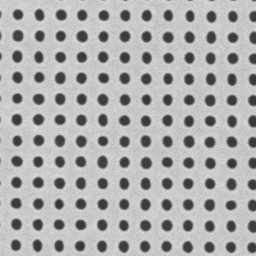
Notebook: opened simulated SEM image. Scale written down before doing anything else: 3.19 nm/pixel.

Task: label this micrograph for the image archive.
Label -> a regular array of holes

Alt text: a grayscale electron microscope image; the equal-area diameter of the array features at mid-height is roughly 34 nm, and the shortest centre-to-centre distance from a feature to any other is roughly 0.0662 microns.